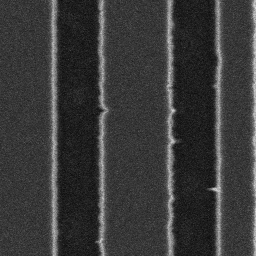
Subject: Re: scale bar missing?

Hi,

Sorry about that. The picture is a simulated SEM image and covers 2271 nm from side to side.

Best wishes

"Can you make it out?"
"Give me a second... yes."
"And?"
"one or a few lines or trenches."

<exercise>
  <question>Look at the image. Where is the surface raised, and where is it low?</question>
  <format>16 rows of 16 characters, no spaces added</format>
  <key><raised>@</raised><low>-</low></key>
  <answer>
@@@---@@@@@---@@
@@@---@@@@@---@@
@@@---@@@@@---@@
@@@---@@@@@---@@
@@@---@@@@@---@@
@@@---@@@@@---@@
@@@---@@@@@---@@
@@@---@@@@@---@@
@@@---@@@@@---@@
@@@---@@@@@---@@
@@@---@@@@@---@@
@@@---@@@@@---@@
@@@---@@@@@---@@
@@@---@@@@@---@@
@@@---@@@@@---@@
@@@---@@@@@---@@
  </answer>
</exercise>